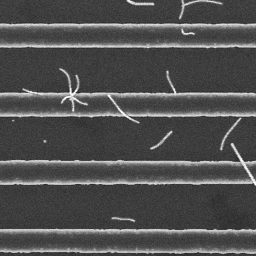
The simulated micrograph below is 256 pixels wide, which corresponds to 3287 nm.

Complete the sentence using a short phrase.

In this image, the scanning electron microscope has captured lines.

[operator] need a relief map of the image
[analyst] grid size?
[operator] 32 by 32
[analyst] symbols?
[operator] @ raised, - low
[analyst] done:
--------------------------------
--------------------------------
--------------------------------
@@@@@@@@@@@@@@@@@@@@@@@@@@@@@@@@
@@@@@@@@@@@@@@@@@@@@@@@@@@@@@@@@
@@@@@@@@@@@@@@@@@@@@@@@@@@@@@@@@
--------------------------------
--------------------------------
--------------------------------
--------------------------------
--------------------------------
--------------------------------
@@@@@@@@@@@@@@@@@@@@@@@@@@@@@@@@
@@@@@@@@@@@@@@@@@@@@@@@@@@@@@@@@
---------------@@---------------
--------------------------------
--------------------------------
--------------------------------
--------------------------------
--------------------------------
@@@@@@@@@@@@@@@@@@@@@@@@@@@@@@@@
@@@@@@@@@@@@@@@@@@@@@@@@@@@@@@@@
@@@@@@@@@@@@@@@@@@@@@@@@@@@@@@@@
--------------------------------
--------------------------------
--------------------------------
--------------------------------
--------------------------------
--------------------------------
@@@@@@@@@@@@@@@@@@@@@@@@@@@@@@@@
@@@@@@@@@@@@@@@@@@@@@@@@@@@@@@@@
----------@@@-@@@@@@@@@--@@@@@@@